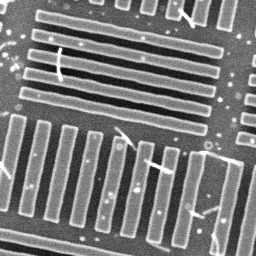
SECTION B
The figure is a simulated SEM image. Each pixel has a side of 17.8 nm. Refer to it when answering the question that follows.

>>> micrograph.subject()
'groups of lines, slits or small figures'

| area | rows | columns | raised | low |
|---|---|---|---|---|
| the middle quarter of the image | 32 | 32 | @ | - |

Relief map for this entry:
@@@@@@@@@@@@-----------@@@@@@@@@
----@@@@@@@@@@@@@-----------@@@@
----------@@@@@@@@@@@@@---------
@@@@----------@@@@@@@@@@@@@-----
@@@@@@@@-----------@@@@@@@@@@@@@
@@@@@@@@@@@@-----------@@@@@@@@@
----@@@@@@@@@@@@@-----------@@@@
---------@@@@@@@@@@@@@----------
@@@-----------@@@@@@@@@@@@@-----
@@@@@@@-----------@@@@@@@@@@@@@@
@@@@@@@@@@@@-----------@@@@@@@@@
----@@@@@@@@@@@@@----------@@@@@
--------@@@@@@@@@@@@@@----------
-------------@@@@@@@@@@@@@@@----
-------------------@@@@@@@@@@@@@
@@---------------------@@@@@@@@@
@@@-------------------------@@@@
@@@---@@@@----------------------
@@@---@@@----@@@----------------
@@@---@@@---@@@@---@------------
@@----@@@---@@@@---@@@----------
@@---@@@@---@@@@---@@@---@@@@---
@@---@@@----@@@---@@@@---@@@@---
@@---@@@---@@@@---@@@@---@@@@--@
@@---@@@---@@@@---@@@@---@@@---@
@---@@@@---@@@@---@@@---@@@@---@
@---@@@@---@@@@---@@@---@@@@---@
@---@@@@---@@@---@@@@---@@@@---@
@---@@@---@@@@---@@@@---@@@---@@
@---@@@---@@@@---@@@----@@@---@@
---@@@@---@@@@---@@@---@@@@---@@
---@@@@---@@@----@@@---@@@@---@@